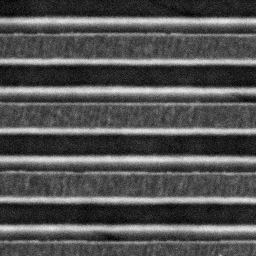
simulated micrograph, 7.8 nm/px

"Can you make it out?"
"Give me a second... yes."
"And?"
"lines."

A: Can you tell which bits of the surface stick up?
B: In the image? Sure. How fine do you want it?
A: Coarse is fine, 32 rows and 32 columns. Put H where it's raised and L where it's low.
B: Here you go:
LLLLLLLLLLLLLLLLLLLLLLLLLLLLLLLL
LLLLLLLLLLLLLLLLLLLLLLLLLLLLLLLL
LLLLLLLLLLLLLLLLLLLLLLLLLLLLLLLL
HHHHHHHHHHHHHHHHHHHHHHHHHHHHHHHH
HHHHHHHHHHHHHHHHHHHHHHHHHHHHHHHH
HHHHHHHHHHHHHHHHHHHHHHHHHHHHHHHH
HHHHHHHHHHHHHHHHHHHHHHHHHHHHHHHH
HHHHHHHHHHHHHHHHHHHHHHHHHHHHHHHH
LLLLLLLLLLLLLLLLLLLLLLLLLLLLLLLL
LLLLLLLLLLLLLLLLLLLLLLLLLLLLLLLL
LLLLLLLLLLLLLLLLLLLLLLLLLLLLLLLL
HHHHHHHHHHHHHHHHHHHHHHHHHHHHHHHH
HHHHHHHHHHHHHHHHHHHHHHHHHHHHHHHH
HHHHHHHHHHHHHHHHHHHHHHHHHHHHHHHH
HHHHHHHHHHHHHHHHHHHHHHHHHHHHHHHH
HHHHHHHHHHHHHHHHHHHHHHHHHHHHHHHH
LLLLLLLLLLLLLLLLLLLLLLLLLLLLLLLL
LLLLLLLLLLLLLLLLLLLLLLLLLLLLLLLL
LLLLLLLLLLLLLLLLLLLLLLLLLLLLLLLL
LLLLLLLLLLLLLLLLLLLLLLLLLLLLLLLL
HHHHHHHHHHHHHHHHHHHHHHHHHHHHHHHH
HHHHHHHHHHHHHHHHHHHHHHHHHHHHHHHH
HHHHHHHHHHHHHHHHHHHHHHHHHHHHHHHH
HHHHHHHHHHHHHHHHHHHHHHHHHHHHHHHH
HHHHHHHHHHHHHHHHHHHHHHHHHHHHHHHH
LLLLLLLLLLLLLLLLLLLLLLLLLLLLLLLL
LLLLLLLLLLLLLLLLLLLLLLLLLLLLLLLL
LLLLLLLLLLLLLLLLLLLLLLLLLLLLLLLL
LLLLLLLLLLLLLLLLLLLLLLLLLLLLLLLL
HHHHHHHHHHHHHHHHHHHHHHHHHHHHHHHH
HHHHHHHHHHHHHHHHHHHHHHHHHHHHHHHH
HHHHHHHHHHHHHHHHHHHHHHHHHHHHHHHH